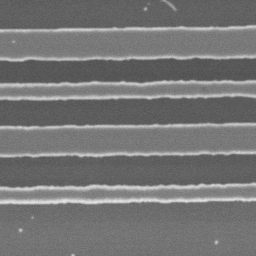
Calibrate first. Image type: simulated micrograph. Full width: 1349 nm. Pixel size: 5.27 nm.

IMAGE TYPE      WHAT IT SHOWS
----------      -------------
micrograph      lines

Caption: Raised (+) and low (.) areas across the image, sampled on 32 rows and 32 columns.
................................
................................
................................
..............++++++++++++++++++
++++++++++++++++++++++++++++++++
++++++++++++++++++++++++++++++++
++++++++++++++++++++++++++++++++
.++.............................
................................
................................
++++++++++++++++++++++++++++++++
++++++++++++++++++++++++++++++++
................................
................................
................................
.........................++.++++
++++++++++++++++++++++++++++++++
++++++++++++++++++++++++++++++++
++++++++++++++++++++++++++++++++
+++++.....+++...................
................................
................................
................................
+..+++++++++++++++++++++++++++++
++++++++++++++++++++++++++++++++
................................
................................
................................
................................
................................
................................
................................